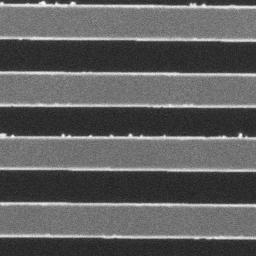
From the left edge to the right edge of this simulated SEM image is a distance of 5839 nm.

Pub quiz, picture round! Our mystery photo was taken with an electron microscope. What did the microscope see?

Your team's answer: lines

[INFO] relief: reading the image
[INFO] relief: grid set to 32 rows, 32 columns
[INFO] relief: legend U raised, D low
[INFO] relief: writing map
DDDDDDDDDDDDDDDDDDDDDDDDDDDDDDDD
UUUUUUUUUUUUUUUUUUUUUUUUUUUUUUUU
UUUUUUUUUUUUUUUUUUUUUUUUUUUUUUUU
UUUUUUUUUUUUUUUUUUUUUUUUUUUUUUUU
UUUUUUUUUUUUUUUUUUUUUUUUUUUUUUUU
DDDDDDDDDDDDDDDDDDDDDDDDDDDDDDDD
DDDDDDDDDDDDDDDDDDDDDDDDDDDDDDDD
DDDDDDDDDDDDDDDDDDDDDDDDDDDDDDDD
DDDDDDDDDDDDDDDDDDDDDDDDDDDDDDDD
UUUUUUUUUUUUUUUUUUUUUUUUUUUUUUUU
UUUUUUUUUUUUUUUUUUUUUUUUUUUUUUUU
UUUUUUUUUUUUUUUUUUUUUUUUUUUUUUUU
UUUUUUUUUUUUUUUUUUUUUUUUUUUUUUUU
DDDDDDDDDDDDDDDDDDDDDDDDDDDDDDDD
DDDDDDDDDDDDDDDDDDDDDDDDDDDDDDDD
DDDDDDDDDDDDDDDDDDDDDDDDDDDDDDDD
DDDDDDDDDDDDDDDDDDDDDDDDDDDDDDDD
UUUUUUUUUUUUUUUUUUUUUUUUUUUUUUUU
UUUUUUUUUUUUUUUUUUUUUUUUUUUUUUUU
UUUUUUUUUUUUUUUUUUUUUUUUUUUUUUUU
UUUUUUUUUUUUUUUUUUUUUUUUUUUUUUUU
DDDDDDDDDDDDDDDDDDDDDDDDDDDDDDDD
DDDDDDDDDDDDDDDDDDDDDDDDDDDDDDDD
DDDDDDDDDDDDDDDDDDDDDDDDDDDDDDDD
DDDDDDDDDDDDDDDDDDDDDDDDDDDDDDDD
UUUUUUUUUUUUUUDUUDDDDDDDDDDDDDDD
UUUUUUUUUUUUUUUUUUUUUUUUUUUUUUUU
UUUUUUUUUUUUUUUUUUUUUUUUUUUUUUUU
UUUUUUUUUUUUUUUUUUUUUUUUUUUUUUUU
DDDDDDUUUUUUUUUUUUUUUUUUUUUUUUUU
DDDDDDDDDDDDDDDDDDDDDDDDDDDDDDDD
DDDDDDDDDDDDDDDDDDDDDDDDDDDDDDDD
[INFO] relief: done